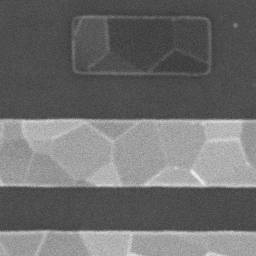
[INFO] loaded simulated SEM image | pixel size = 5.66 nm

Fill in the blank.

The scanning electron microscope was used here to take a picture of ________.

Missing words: wiring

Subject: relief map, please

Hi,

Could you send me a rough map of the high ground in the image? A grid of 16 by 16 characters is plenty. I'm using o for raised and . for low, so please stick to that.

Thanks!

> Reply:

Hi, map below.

................
.....oooooooo...
.....oooooooo...
.....oooooooo...
.....oooooooo...
................
................
................
oooooooooooooooo
oooooooooooooooo
oooooooooooooooo
oooooooooooooooo
................
................
.ooooooo..o..oo.
oooooooooooooooo